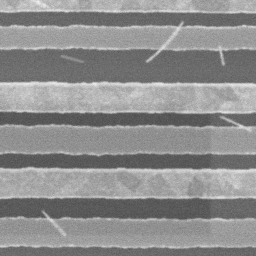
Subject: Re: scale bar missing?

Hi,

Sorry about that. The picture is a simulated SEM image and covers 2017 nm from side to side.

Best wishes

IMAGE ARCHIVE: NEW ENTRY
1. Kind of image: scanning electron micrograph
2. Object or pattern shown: lines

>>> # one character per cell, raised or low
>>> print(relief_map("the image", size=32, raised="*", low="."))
********************************
.........................*******
................................
********************************
********************************
********************************
................................
................................
................................
................................
.*******....**..*..**.*.........
********************************
********************************
********************************
................................
................................
********************************
********************************
********************************
................................
................................
********************************
********************************
********************************
********************************
................................
................................
**********************.*********
********************************
********************************
********************************
................................